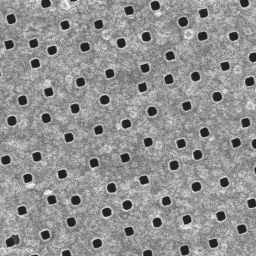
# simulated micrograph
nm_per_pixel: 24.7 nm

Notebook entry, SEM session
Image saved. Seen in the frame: a regular array of holes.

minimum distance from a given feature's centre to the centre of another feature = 636 nm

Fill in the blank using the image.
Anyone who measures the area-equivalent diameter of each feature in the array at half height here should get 9.84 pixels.